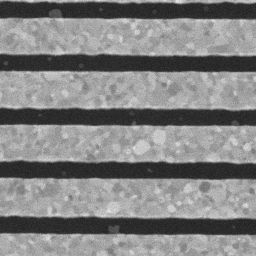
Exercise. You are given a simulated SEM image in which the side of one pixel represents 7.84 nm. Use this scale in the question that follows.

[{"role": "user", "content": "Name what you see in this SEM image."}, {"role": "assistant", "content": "lines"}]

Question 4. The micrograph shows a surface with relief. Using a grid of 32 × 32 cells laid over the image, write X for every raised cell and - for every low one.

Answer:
--------------------------------
--------------------------------
XXXXXXXXXXXXXXXXXXXXXXXXXXXXXXXX
XXXXXXXXXXXXXXXXXXXXXXXXXXXXXXXX
XXXXXXXXXXXXXXXXXXXXXXXXXXXXXXXX
XXXXXXXXXXXXXXXXXXXXXXXXXXXXXXXX
XXXXXXXXXXXXXXXXXXXXXXXXXXXXXXXX
--------------------------------
--------------------------------
XXXXXXXXXXXXXXXXXXXXXXXXXXXXXXXX
XXXXXXXXXXXXXXXXXXXXXXXXXXXXXXXX
XXXXXXXXXXXXXXXXXXXXXXXXXXXXXXXX
XXXXXXXXXXXXXXXXXXXXXXXXXXXXXXXX
-XX-XXXXX-XXXXXXXXXXXXXXXXXXXXXX
--------------------------------
--------------------------------
XXXXXXXXXXXXXXXXXXXXXXXXXXXXXXXX
XXXXXXXXXXXXXXXXXXXXXXXXXXXXXXXX
XXXXXXXXXXXXXXXXXXXXXXXXXXXXXXXX
XXXXXXXXXXXXXXXXXXXXXXXXXXXXXXXX
--------------------------------
--------------------------------
XXXXXXXXXXXXXXXXXXXXXXXXXX--XX-X
XXXXXXXXXXXXXXXXXXXXXXXXXXXXXXXX
XXXXXXXXXXXXXXXXXXXXXXXXXXXXXXXX
XXXXXXXXXXXXXXXXXXXXXXXXXXXXXXXX
XXXXXXXXXXXXXXXXXXXXXXXXXXXXXXXX
--------------------------------
--------------------------------
XXXXXXXXXXXXXXXXXXXXXXXXXXXXXXXX
XXXXXXXXXXXXXXXXXXXXXXXXXXXXXXXX
XXXXXXXXXXXXXXXXXXXXXXXXXXXXXXXX